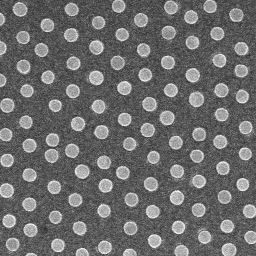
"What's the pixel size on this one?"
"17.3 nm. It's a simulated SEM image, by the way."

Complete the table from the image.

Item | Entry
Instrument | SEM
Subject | a regular array of raised bodies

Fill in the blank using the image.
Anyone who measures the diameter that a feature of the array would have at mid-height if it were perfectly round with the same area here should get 12.8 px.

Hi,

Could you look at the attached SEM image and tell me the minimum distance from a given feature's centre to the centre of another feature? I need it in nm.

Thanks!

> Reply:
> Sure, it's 421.